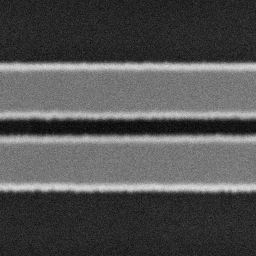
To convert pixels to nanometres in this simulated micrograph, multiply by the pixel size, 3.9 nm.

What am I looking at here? lines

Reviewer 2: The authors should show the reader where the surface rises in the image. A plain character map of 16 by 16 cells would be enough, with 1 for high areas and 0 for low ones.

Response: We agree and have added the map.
0000000000000000
0000000000000000
0000000000000000
0000000000000000
1111111111111111
1111111111111111
1111111111111111
0000000000000000
0000000000000000
1111111111111111
1111111111111111
1111111111111111
0000000000000000
0000000000000000
0000000000000000
0000000000000000